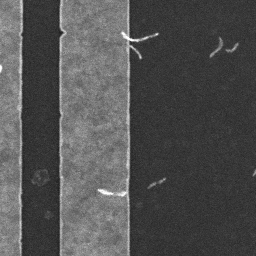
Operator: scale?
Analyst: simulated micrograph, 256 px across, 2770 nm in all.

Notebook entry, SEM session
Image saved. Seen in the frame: one or a few lines or trenches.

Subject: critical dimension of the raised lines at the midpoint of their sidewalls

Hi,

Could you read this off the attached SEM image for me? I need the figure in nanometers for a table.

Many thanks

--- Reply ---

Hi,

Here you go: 742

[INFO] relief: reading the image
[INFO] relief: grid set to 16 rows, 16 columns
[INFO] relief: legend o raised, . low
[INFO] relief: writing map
o...oooo........
o...oooo........
o...oooo........
o...oooo........
o...oooo........
o...oooo........
o...oooo........
o...oooo........
o...oooo........
o...oooo........
o...oooo........
o...oooo........
o...oooo........
o...oooo........
o...oooo........
o...oooo........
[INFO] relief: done